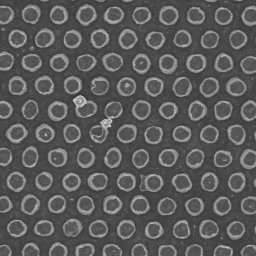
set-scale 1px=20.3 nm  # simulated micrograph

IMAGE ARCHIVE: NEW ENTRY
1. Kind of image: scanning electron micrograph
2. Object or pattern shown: a regular array of raised bodies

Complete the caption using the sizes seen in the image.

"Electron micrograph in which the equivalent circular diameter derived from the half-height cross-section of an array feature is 345 nm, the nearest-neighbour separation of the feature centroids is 541 nm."